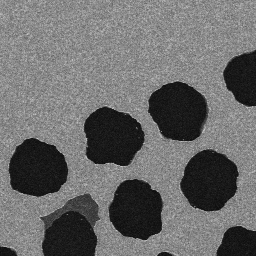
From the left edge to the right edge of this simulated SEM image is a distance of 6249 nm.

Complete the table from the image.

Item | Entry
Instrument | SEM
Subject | holes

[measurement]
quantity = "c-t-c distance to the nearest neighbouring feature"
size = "1850 nanometres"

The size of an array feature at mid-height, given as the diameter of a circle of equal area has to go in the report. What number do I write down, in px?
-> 58.9